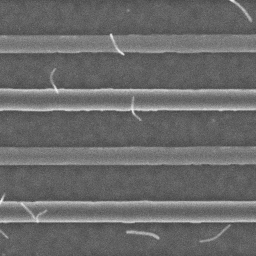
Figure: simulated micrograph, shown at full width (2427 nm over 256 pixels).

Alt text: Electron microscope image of lines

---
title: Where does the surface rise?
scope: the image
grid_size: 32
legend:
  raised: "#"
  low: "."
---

................................
................................
................................
................................
#............#..##.......###.###
################################
##########....##..###.###.......
................................
................................
................................
................................
################################
################################
################################
................................
................................
................................
................................
..............#######.##########
################################
####################.###....#...
................................
................................
................................
................................
################################
################################
################################
................................
................................
................................
................................